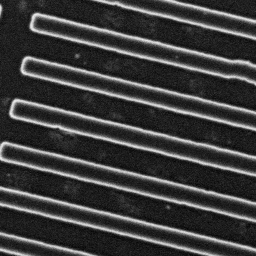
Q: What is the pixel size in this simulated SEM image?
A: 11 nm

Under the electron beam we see parallel lines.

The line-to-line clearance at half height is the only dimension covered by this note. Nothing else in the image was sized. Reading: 296 nm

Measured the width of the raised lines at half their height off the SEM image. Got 0.19 um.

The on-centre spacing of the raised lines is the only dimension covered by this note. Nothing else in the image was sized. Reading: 487 nanometres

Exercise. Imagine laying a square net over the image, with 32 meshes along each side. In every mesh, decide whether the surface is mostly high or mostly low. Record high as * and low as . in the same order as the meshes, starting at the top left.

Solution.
..............*********.........
..................*********.....
....****..............*********.
....********..............******
.......*********..............**
...........*********............
...............*********........
...**..............*********....
...******..............*********
....*********...............****
........*********...............
............*********...........
.................*********......
.******..............*********..
..********...............*******
.....**********..............***
.........**********.............
.............**********.........
****.............**********.....
********..............*********.
..**********.............*******
......**********..............**
...........*********............
...............*********........
****...............*********....
*********..............*********
....*********..............*****
........*********..............*
............*********...........
**..............*********.......
******..............*********...
.*********..............********